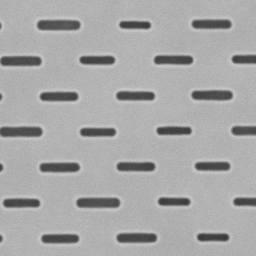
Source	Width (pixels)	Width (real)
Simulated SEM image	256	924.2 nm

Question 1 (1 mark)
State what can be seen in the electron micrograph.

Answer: a regular array of holes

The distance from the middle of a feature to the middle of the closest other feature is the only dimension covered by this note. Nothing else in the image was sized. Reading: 187 nanometers